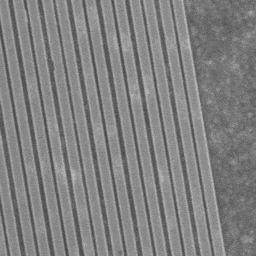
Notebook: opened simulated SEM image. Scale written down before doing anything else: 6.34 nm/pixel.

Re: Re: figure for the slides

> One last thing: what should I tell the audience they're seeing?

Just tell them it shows parallel lines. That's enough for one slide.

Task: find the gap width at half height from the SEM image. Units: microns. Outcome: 0.0274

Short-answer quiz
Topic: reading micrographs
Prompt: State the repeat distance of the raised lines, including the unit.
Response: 91 nm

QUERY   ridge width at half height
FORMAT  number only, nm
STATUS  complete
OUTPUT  60.2